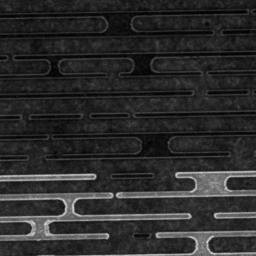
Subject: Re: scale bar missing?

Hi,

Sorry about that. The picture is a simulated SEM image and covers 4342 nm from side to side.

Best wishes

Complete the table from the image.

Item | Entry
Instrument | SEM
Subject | parallel lines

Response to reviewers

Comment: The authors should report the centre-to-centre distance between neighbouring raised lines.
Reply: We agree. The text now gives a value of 342 nm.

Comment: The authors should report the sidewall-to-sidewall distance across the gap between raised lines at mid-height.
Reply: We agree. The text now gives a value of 0.276 micrometres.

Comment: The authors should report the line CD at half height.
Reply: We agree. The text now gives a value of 76.3 nm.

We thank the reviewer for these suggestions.